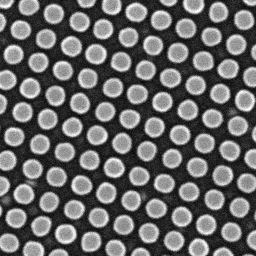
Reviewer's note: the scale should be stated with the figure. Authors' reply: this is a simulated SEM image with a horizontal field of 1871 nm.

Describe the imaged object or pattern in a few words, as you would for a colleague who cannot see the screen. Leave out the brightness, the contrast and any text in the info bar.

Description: a regular array of raised bodies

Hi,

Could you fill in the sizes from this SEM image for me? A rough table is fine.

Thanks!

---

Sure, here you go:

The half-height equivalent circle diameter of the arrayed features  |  138 nanometres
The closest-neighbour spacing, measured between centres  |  185 nm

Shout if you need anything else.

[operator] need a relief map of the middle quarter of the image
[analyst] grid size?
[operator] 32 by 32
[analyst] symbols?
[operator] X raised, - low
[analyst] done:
XX----------XXXX--XXXX----------
XX---XX-------X---XXXXX---XX----
XX--XXXX----------XXXX--XXXXX---
X---XXXX-----------XXX--XXXXX---
----XXXX---XXX----------XXXXX--X
----XXX---XXXX---XX-------XX---X
----------XXXXX-XXXX-----------X
----X-----XXXX--XXXXX---XX------
--XXXX----------XXXXX--XXXX-----
--XXXX-----------XXX--XXXXX---XX
--XXXX---XXX----------XXXXX--XXX
--XXXX--XXXXX-----------X----XXX
--------XXXXX-XXXX-----------XXX
--X------XXX--XXXXX---X-------XX
XXXX----------XXXX---XXXX-------
XXXX-----------XXX--XXXXX-------
XXXX--XXXX-----------XXXX--XXXX-
-XX---XXXXX---X------XXX---XXXX-
------XXXX---XXX-----------XXXX-
-------XXX--XXXXX---X-------XXX-
XX----------XXXXX--XXXX---------
XX-----------XXX---XXXX---XX----
XXX--XXX-----------XXXX--XXXX---
XX--XXXXX----------XXX---XXXX---
----XXXXX--XXX-----------XXXX--X
-----XXX--XXXXX-----------XX---X
----------XXXXX--XXX-----------X
-----------XXX---XXXX-----------
---XXX-----------XXXX--XXXX-----
--XXXX-----------XXXX--XXXX-----
--XXXXX--XXX-----------XXXX---XX
--XXXXX-XXXXX-----------XXX--XXX